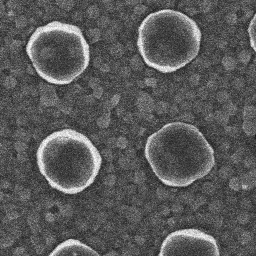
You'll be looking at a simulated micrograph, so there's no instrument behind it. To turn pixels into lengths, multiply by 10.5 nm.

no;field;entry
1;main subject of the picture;raised bodies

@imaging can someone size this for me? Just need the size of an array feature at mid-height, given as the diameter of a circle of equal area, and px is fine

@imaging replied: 59.4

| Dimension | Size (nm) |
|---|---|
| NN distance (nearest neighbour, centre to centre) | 1150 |